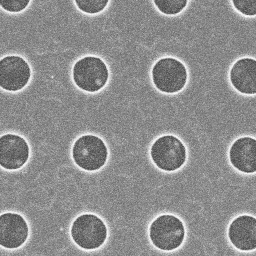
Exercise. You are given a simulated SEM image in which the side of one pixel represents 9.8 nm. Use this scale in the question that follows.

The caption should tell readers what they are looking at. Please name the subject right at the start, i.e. holes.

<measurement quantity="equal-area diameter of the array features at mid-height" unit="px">36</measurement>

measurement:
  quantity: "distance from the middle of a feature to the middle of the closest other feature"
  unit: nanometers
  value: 766